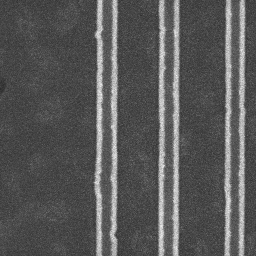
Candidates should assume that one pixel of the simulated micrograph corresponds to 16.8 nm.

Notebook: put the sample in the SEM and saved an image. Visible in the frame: one or a few lines or trenches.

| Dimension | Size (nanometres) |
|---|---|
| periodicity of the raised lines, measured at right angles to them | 1070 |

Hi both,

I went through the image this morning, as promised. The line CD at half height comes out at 15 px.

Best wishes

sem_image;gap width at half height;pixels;49.1